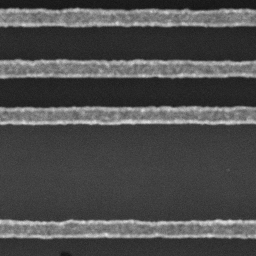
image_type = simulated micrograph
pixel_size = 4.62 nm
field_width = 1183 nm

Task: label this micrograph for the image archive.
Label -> lines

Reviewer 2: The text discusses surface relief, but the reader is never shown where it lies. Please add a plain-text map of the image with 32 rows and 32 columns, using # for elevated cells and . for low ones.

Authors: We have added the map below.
................................
################################
################################
................................
................................
................................
................................
..#.............................
################################
################################
................................
................................
................................
#.##..##########################
################################
#..##.#.....###...........#.#...
................................
................................
................................
................................
................................
................................
................................
................................
................................
................................
................................
................#...............
################################
################################
................................
................................